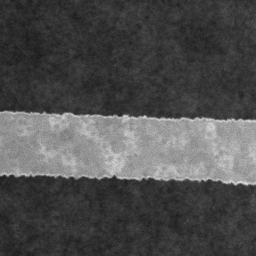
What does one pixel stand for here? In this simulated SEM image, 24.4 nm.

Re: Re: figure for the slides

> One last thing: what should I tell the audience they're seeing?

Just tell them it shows one or a few lines or trenches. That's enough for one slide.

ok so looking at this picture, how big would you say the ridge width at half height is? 1500 nm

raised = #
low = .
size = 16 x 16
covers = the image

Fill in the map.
................
................
................
................
................
................
................
#############...
################
################
################
................
................
................
................
................